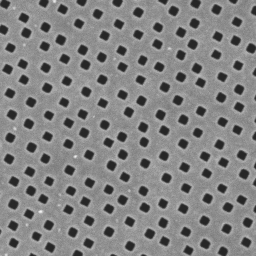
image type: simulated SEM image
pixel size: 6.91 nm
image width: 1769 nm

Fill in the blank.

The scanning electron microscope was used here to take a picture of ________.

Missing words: a regular array of holes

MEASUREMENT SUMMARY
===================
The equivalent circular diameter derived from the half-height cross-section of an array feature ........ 67.5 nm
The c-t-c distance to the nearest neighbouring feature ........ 18.3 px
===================